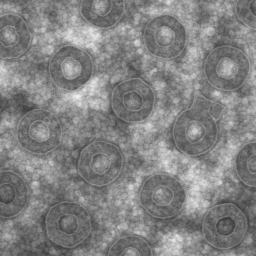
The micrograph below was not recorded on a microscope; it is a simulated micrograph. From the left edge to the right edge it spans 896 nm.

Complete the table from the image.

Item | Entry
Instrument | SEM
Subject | a regular array of ring-shaped raised bodies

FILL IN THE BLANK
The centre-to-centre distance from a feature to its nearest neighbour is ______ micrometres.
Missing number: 0.241